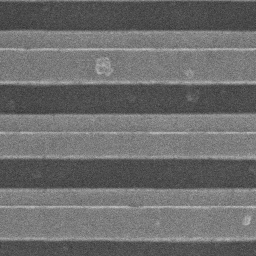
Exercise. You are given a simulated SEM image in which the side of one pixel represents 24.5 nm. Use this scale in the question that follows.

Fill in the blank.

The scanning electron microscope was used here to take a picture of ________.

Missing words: lines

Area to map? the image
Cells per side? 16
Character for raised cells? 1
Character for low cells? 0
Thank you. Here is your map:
0000000000000000
0000000000000000
1111111111111111
1111111111111111
1111111111111111
0000000000000000
0000000000000000
1111111111111111
1111111111111111
1111111111111111
0000000000000000
0000000000000000
1111111111111111
1111111111111111
1111111111111111
0000000000000000